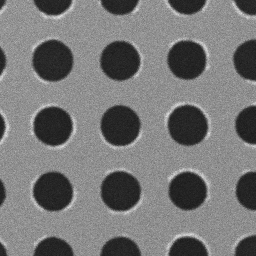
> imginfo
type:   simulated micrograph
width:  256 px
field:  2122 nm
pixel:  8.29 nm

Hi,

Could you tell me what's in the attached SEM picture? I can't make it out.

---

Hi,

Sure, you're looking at a regular array of holes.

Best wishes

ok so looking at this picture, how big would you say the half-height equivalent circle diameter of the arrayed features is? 332 nm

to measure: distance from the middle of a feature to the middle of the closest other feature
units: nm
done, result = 541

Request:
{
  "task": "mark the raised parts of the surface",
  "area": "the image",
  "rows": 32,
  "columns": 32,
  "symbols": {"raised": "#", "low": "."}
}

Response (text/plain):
.###.....####....####.....###...
#####...######..######...#####..
################################
################################
################################
#####...######..######...#####..
####.....####....####.....###...
.###.....####....####.....###...
.###.....####....####.....###...
#####....####....#####...#####..
################################
################################
################################
######..######..######...######.
####.....####....####.....####..
.###.....####.....###.....###...
.###.....####....####.....####..
#####....####....#####...#####..
################################
################################
################################
######.#######..#######.#######.
#####....####....####....#####..
.###.....####.....###.....###...
.###.....####.....###.....####..
#####....####....#####...#####..
################################
################################
################################
###############################.
#####....####....#####...#####..
.###.....####.....###.....###...